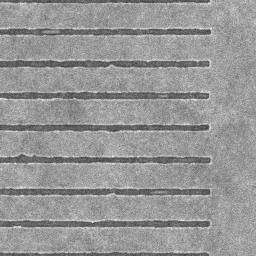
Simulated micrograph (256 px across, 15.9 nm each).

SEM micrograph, parallel lines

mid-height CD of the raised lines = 403 nm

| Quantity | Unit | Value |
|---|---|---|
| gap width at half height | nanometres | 107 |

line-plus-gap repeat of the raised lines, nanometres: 508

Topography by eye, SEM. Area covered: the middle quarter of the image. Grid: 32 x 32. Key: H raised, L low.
LLLLLLLLLLLLLLLLLLLLLLLLLLLLLLLL
HHHHHHHHHHHHHHHHHHHHHHHHHHHHHHHH
HHHHHHHHHHHHHHHHHHHHHHHHHHHHHHHH
HHHHHHHHHHHHHHHHHHHHHHHHHHHHHHHH
HHHHHHHHHHHHHHHHHHHHHHHHHHHHHHHH
HHHHHHHHHHHHHHHHHHHHHHHHHHHHHHHH
HHHHHHHHHHHHHHHHHHHHHHHHHHHHHHHH
LLLLLLLLLLLLLLLLLLLLLLLLLLLLLLLL
LLLLLLLLLLLLLLLLLLLLLLLLLLLLLLLL
HHHHHHHHHHHHHHHHHHHHHHHHHHHHHHHH
HHHHHHHHHHHHHHHHHHHHHHHHHHHHHHHH
HHHHHHHHHHHHHHHHHHHHHHHHHHHHHHHH
HHHHHHHHHHHHHHHHHHHHHHHHHHHHHHHH
HHHHHHHHHHHHHHHHHHHHHHHHHHHHHHHH
HHHHHHHHHHHHHHHHHHHHHHHHHHHHHHHH
LLLLLLLLLLLLLLLLLLLLLLLLLLLLLLLL
LLLLLLLLLLLLLLLLLLLLLLLLLLLLLLLL
HHHHHHHHHHHHHHHHHHHHHHHHHHHHHHHH
HHHHHHHHHHHHHHHHHHHHHHHHHHHHHHHH
HHHHHHHHHHHHHHHHHHHHHHHHHHHHHHHH
HHHHHHHHHHHHHHHHHHHHHHHHHHHHHHHH
HHHHHHHHHHHHHHHHHHHHHHHHHHHHHHHH
HHHHHHHHHHHHHHHHHHHHHHHHHHHHHHHH
LLLLLLLLLLLLLLLLLLLLLLLLLLLLLLLL
LLLLLLLLLLLLLLLLLLLLLLLLLLLLLLLL
HHHHHHHHHHHHHHHHHHHHHHHHHHHHHHHH
HHHHHHHHHHHHHHHHHHHHHHHHHHHHHHHH
HHHHHHHHHHHHHHHHHHHHHHHHHHHHHHHH
HHHHHHHHHHHHHHHHHHHHHHHHHHHHHHHH
HHHHHHHHHHHHHHHHHHHHHHHHHHHHHHHH
HHHHHHHHHHHHHHHHHHHHHHHHHHHHHHHH
LLLLLLLLLLLLLLLLLLLLLLLLLLLLLLLL